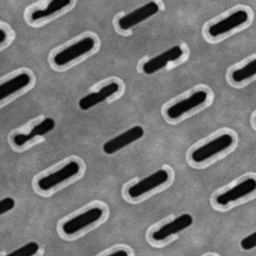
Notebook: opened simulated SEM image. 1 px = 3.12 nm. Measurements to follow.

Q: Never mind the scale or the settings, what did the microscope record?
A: a regular array of holes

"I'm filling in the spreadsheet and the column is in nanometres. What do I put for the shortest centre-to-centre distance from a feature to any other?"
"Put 157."